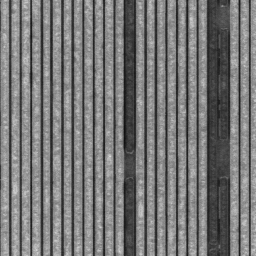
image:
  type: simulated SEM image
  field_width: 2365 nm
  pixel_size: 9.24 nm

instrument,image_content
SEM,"parallel lines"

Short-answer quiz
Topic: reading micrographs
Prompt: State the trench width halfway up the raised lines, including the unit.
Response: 25.4 nm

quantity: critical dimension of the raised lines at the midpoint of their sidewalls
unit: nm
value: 77.4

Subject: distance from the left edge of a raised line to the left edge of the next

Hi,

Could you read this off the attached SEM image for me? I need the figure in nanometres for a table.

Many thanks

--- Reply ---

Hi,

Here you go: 96.3